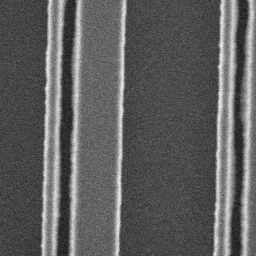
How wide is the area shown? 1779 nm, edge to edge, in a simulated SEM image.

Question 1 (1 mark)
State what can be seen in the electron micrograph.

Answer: lines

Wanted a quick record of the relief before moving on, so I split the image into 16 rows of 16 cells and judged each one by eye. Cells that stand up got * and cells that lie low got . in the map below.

...*****......**
...*****......**
...*****......**
...*****......**
...*****......**
...*****......**
...*****......**
...*****......**
...*****......**
...*****......**
...****.......**
...****.......**
...****.......**
...****......***
...****......***
...****......***